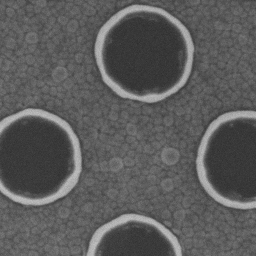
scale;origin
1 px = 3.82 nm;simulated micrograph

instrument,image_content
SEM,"raised bodies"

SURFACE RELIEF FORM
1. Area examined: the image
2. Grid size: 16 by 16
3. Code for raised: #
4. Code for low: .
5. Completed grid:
........#.......
.......####.....
......######....
......######....
......######....
.......####.....
................
.###..........##
#####........###
#####........###
#####........###
####.........###
.##...........##
................
......####......
......#####.....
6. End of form